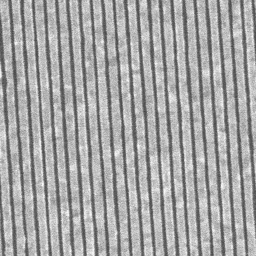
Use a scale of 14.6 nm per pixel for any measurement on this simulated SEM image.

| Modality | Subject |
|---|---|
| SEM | parallel lines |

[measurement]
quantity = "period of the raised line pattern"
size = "169 nanometers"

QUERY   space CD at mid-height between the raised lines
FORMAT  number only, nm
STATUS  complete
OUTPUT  65.6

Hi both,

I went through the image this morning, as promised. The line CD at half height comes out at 108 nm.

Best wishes